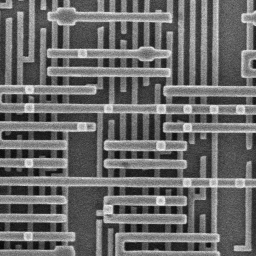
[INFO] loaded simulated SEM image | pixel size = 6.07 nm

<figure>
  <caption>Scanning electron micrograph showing wiring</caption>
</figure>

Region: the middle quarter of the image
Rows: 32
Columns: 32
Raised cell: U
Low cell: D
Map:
DDDDDDDDDDDDDDDDDDDDDDDDDDDDDDDD
UUUUUUUUUUUUUUUUUUUUUUUUUUDDDDDD
UUUUUUUUUUUUUUUUUUUUUUUUUUDDDDDD
DDDDDDDDDDDDDDDDDDDDDDDDDDDDDDDD
DDDDDDDDDDDDDDDDDDDDDDDDDDDDDDDD
DDDDDDDDDDDDDDDDDDDDDDDDDDDDDDDD
UUUUUUUUDDDDDDDDDDDDDDDDDUUUUUUU
UUUUUUUUDDDDDDDDDDDDDDDDDUUUUUUU
DDDDDDDDDDDDDDDDDDDDDDDDDDDDDDDD
DDDDDDDDDDDDDDDDDDDDDDDDDDDDDDDD
UUUUUUUUUUUUUUUUUUUUUUUUUUUUUUUU
UUUUUUUUUUUUUUUUUUUUUUUUUUUUUUUU
DDDDDDDDDDDDDDDDDDDDDDDDDDDDDDDD
DDDDDDDDDDDDDDDDDDDDDDDDDDDDDDDD
DDDDDDDDDDDDDDDDDDDDDDDDDDDDDDDD
UUUUUUUUDDDDDDDDDDDDDDDDDUUUUUUU
UUUUUUUUDDDDDDDDDDDDDDDDDUUUUUUU
DDDDDDDDDDDDDDDDDDDDDDDDDDDDDDDD
DDDDDDDDDDDDDDDDDDDDDDDDDDDDDDDD
UDDDDDDDDDUUUUUUUUUUUUUUUUUUUUUD
UDDDDDDDDDUUUUUUUUUUUUUUUUUUUUUD
DDDDDDDDDDUUUUUUUUUUUUUUUUUUUUUD
DDDDDDDDDDDDDDDDDDDDDDDDDDDDDDDD
DDDDDDDDDDDDDDDDDDDDDDDDDDDDDDDD
UDDDDDDDDDUUUUUUUUUUUUUUUUUUUUUD
UDDDDDDDDDUUUUUUUUUUUUUUUUUUUUUD
DDDDDDDDDDDDDDDDDDDDDDDDDDDDDDDD
DDDDDDDDDDDDDDDDDDDDDDDDDDDDDDDD
UUUUUDDDDDDDDDDDDUUUUDDDDDDDDDDD
UUUUUUUUUUUUUUUUUUUUUUUUUUUUUUUU
DDDDDDDDDDDDDDDUUUUUUUUUUUUUUUUU
DDDDDDDDDDDDDDDDDDDDDDDDDDDDDDDD